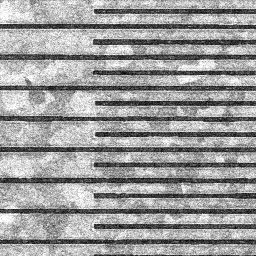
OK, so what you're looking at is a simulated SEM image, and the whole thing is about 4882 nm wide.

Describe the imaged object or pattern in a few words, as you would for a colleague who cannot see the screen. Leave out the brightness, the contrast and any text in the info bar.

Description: parallel lines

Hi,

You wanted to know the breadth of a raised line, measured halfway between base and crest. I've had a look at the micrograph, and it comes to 181 nm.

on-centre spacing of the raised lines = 293 nanometres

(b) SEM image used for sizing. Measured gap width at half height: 107 nanometres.